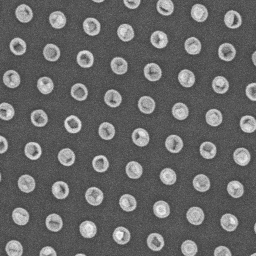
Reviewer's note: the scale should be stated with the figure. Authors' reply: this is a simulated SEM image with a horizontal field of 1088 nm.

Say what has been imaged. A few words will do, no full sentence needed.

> a regular array of raised bodies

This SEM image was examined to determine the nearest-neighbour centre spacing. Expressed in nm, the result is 141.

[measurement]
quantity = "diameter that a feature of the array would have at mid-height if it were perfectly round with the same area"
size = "16.8 pixels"